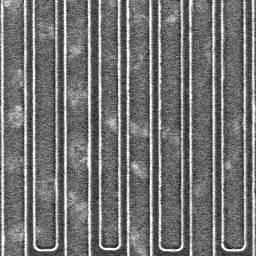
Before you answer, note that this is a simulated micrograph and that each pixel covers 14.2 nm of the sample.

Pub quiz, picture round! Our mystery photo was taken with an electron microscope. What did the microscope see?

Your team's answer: parallel lines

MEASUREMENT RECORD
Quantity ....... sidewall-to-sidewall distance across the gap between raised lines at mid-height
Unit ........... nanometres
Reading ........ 313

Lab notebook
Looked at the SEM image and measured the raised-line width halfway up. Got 134 nanometers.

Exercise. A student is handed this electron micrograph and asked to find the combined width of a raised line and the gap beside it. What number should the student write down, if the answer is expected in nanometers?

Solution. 443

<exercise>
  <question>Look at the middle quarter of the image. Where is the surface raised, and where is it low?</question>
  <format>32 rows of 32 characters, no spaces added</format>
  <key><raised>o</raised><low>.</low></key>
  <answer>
......ooo.....oo......oo.....ooo
......ooo.....oo......oo.....ooo
......ooo.....oo......oo.....ooo
......ooo.....oo......oo.....ooo
......ooo.....oo......oo.....ooo
......ooo.....oo......oo.....ooo
......ooo.....oo......oo.....ooo
......ooo.....oo......oo.....ooo
......ooo.....oo......oo.....ooo
......ooo.....oo......oo.....ooo
......ooo.....oo......oo.....ooo
......ooo.....oo......oo.....ooo
......ooo.....oo......oo.....ooo
......ooo.....oo......oo.....ooo
......ooo.....oo......oo.....ooo
......ooo.....oo......oo.....ooo
......ooo.....oo......oo.....ooo
......ooo.....oo......oo.....ooo
......ooo.....oo......oo.....ooo
......ooo.....oo......oo.....ooo
......ooo.....oo......oo.....ooo
......ooo.....oo......oo.....ooo
......ooo.....oo......oo.....ooo
......ooo.....oo......oo.....ooo
......ooo.....oo......oo.....ooo
......ooo.....oo.o....oo.....ooo
......ooo.....oo.oo...oo.....ooo
......ooo.....oo......oo.....ooo
......ooo.....oo......oo.....ooo
......ooo.....oo......oo.....ooo
......ooo.....oo......oo......oo
......ooo.....oo......oo......oo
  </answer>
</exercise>